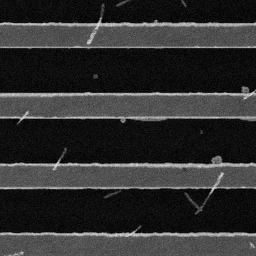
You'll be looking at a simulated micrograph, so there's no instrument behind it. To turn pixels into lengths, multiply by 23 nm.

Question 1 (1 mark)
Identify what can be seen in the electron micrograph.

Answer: lines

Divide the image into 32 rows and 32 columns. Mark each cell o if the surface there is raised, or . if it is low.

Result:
................................
................................
................................
oooooooooooooooooooooooooooooooo
oooooooooooooooooooooooooooooooo
oooooooooooooooooooooooooooooooo
................................
................................
................................
................................
................................
................................
oooooooooooooooooooooooooooooooo
oooooooooooooooooooooooooooooooo
oooooooooooooooooooooooooooooooo
................................
................................
................................
................................
................................
.oo....oo...o..............oo..o
oooooooooooooooooooooooooooooooo
oooooooooooooooooooooooooooooooo
ooooo.oooooooooooooo..o...o....o
................................
................................
................................
................................
................................
oooooooooooooooooooooooooooooooo
oooooooooooooooooooooooooooooooo
oooooooooooooooooooooooooooooooo